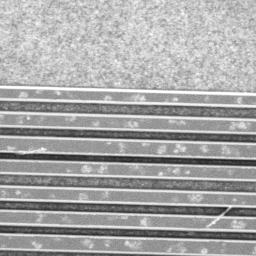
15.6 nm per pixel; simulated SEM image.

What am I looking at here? parallel lines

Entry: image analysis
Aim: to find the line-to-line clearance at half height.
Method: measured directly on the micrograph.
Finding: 0.142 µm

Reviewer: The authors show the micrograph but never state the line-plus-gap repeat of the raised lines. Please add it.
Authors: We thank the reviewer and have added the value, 386 nm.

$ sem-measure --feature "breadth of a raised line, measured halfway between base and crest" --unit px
14.5